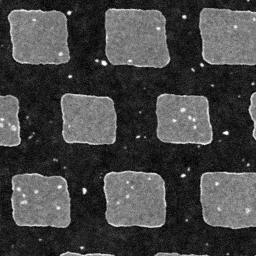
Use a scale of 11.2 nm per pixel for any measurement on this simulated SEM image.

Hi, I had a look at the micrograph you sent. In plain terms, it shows raised bodies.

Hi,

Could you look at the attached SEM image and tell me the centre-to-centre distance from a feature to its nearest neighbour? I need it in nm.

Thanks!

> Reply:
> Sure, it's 1050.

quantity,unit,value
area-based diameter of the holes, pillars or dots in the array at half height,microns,0.676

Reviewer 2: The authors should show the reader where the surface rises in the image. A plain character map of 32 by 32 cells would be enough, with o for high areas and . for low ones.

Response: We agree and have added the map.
................................
..ooooo......ooooooo.....ooooooo
.ooooooo.....oooooooo....ooooooo
.ooooooo.....oooooooo....ooooooo
.ooooooo.....oooooooo....ooooooo
..oooooo.....oooooooo....ooooooo
..ooooooo....oooooooo....ooooooo
..ooooooo.....ooooooo.....oooooo
................................
................................
................................
................................
oo......oooooo......oooooo.....o
oo......oooooo......oooooo.....o
oo......oooooo......oooooo.....o
oo......oooooo......oooooo......
oo......oooooo......oooooo......
ooo.....oooooo......oooooo......
................................
................................
................................
...............oo...............
..oooooo.....ooooooo.....ooooooo
..oooooo.....oooooooo....ooooooo
.oooooooo....oooooooo....ooooooo
.oooooooo....oooooooo....ooooooo
..ooooooo....oooooooo....ooooooo
..ooooooo....oooooooo.....oooooo
.............................o..
................................
................................
................................